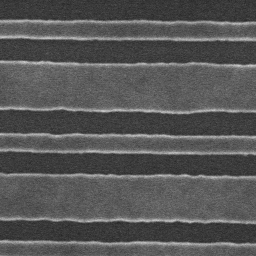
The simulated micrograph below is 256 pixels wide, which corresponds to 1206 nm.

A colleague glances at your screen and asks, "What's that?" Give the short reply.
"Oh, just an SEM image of lines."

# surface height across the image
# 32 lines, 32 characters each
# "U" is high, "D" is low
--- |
DDDDDDDDDDDDDDDDDDDDDDDDDDDDDDDD
DDDDDDDDDDDDDDDDDDDDDDDDDDDDDDDD
DDDDDDDDDDDDDDDDDDDDDDDDDDDDDDDD
UUUUUUUUUUUUUUUUUUUUUUUUUUUUUUUU
UUUUUUUUUUUUUUUUUUUUUUUUUUUUUUUU
DDDDDDDDDDDDDDDDDDDDDDDDDDDDDDDD
DDDDDDDDDDDDDDDDDDDDDDDDDDDDDDDD
DDDDDDDDDDDDDDDDDDDDDDDDDDDDDDDD
UUUUUUUUUUUUUUUUUUUUUUUUUUUUUUUU
UUUUUUUUUUUUUUUUUUUUUUUUUUUUUUUU
UUUUUUUUUUUUUUUUUUUUUUUUUUUUUUUU
UUUUUUUUUUUUUUUUUUUUUUUUUUUUUUUU
UUUUUUUUUUUUUUUUUUUUUUUUUUUUUUUU
UUUUUUUUUUUUUUUUUUUUUUUUUUUUUUUU
DDDDDDDDDDDDDDDDDDDDDDDDDDDDDDDD
DDDDDDDDDDDDDDDDDDDDDDDDDDDDDDDD
DDDDDDDDDDDDDDDDDDDDDDDDDDDDDDDD
UUUUUUUUUUUUUUUUUUUUUUUUUUUUUUUU
UUUUUUUUUUUUUUUUUUUUUUUUUUUUUUUU
DDDDDDDDDDDDDDDDDDDDDDDDDDDDDDDD
DDDDDDDDDDDDDDDDDDDDDDDDDDDDDDDD
DDDDDDDDDDDDDDDDDDDDDDDDDDDDDDDD
UUUUUUUUUUUUUUUUUUUUUUUUUUUUUUUU
UUUUUUUUUUUUUUUUUUUUUUUUUUUUUUUU
UUUUUUUUUUUUUUUUUUUUUUUUUUUUUUUU
UUUUUUUUUUUUUUUUUUUUUUUUUUUUUUUU
UUUUUUUUUUUUUUUUUUUUUUUUUUUUUUUU
UUDUUDUUUUUUUUUUUUUUUUUUUUUUUUUU
DDDDDDDDDDDDDDDDDDDDDDDDDDDDDDDD
DDDDDDDDDDDDDDDDDDDDDDDDDDDDDDDD
UUUUUUUUUUUUUUUUUUUUUUUUUUUUUUUU
UUUUUUUUUUUUUUUUUUUUUUUUUUUUUUUU